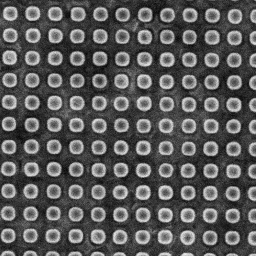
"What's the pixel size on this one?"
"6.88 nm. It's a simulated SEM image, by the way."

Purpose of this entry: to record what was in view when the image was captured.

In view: a regular array of raised bodies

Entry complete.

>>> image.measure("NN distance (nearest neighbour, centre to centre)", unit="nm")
152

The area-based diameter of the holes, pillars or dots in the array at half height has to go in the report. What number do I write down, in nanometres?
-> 94.8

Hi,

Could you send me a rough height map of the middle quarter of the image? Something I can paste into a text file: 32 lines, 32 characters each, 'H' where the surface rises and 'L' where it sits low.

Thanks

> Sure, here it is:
LLLLLLLLLLLLLLLLLLLLLLLLLHHLLLLL
LLLLLLLLLLLLLLLLLLLLLLLLLLLLLLLL
LLLLLLLLLLLLLLLLLLLLLLLLLLLLLLLL
LLHHHLLHHHLLLHHHLLLHHLLLHHHLLLHH
LLHHHLLHHHLLLHHHLLHHHHLLHHHLLLHH
LLHHLLLLHHLLLHHHLLLHHLLLHHHLLLHH
LLLLLLLLLLLLLLLLLLLLLLLLLLLLLLLL
LLLLLLLLLLLLLLLLLLLLLLLLLLLLLLLL
LLHHLLLHHHLLLHHLLLLHHLLLLLLLLLLL
LLHHHLLHHHLLLHHHLLHHHHLLHHHLLLHH
LLHHHLLHHHLLLHHHLLHHHHLLHHHLLLHH
LLLLLLLLLLLLLLLLLLLLLLLLLLLLLLHH
LLLLLLLLLLLLLLLLLLLLLLLLLLLLLLLL
LLLLLLLLLLLLLLLLLLLLLLLLLLLLLLLL
LLHHHLLHHHLLLHHHLLLHHLLLHHHLLLHH
LLHHHLLHHHLLLHHHLLHHHLLLHHHLLLHH
LLHHLLLLHHLLLHHHLLLHHLLLHHHLLLHH
LLLLLLLLLLLLLLLLLLLLLLLLLLLLLLLL
LLLLLLLLLLLLLLLLLLLLLLLLLLLLLLLL
LLHHLLLLHHLLLHHLLLLHLLLLLLLLLLLL
LLHHHLLHHHLLLHHHLLHHHLLLHHHLLLHH
LLHHHLLHHHLLLHHHLLHHHLLLHHHLLLHH
LLLLLLLLLLLLLLHLLLLHHLLLLHLLLLHH
LLLLLLLLLLLLLLLLLLLLLLLLLLLLLLLL
LLLLLLLLLLLLLLLLLLLLLLLLLLLLLLLL
LLHHHLLHHHLLLHHHLLLHHLLLHHHLLLHH
LHHHHLLHHHLLLHHHLLHHHLLLHHHLLHHH
LLHHLLLHHHLLLHHHLLHHHLLLHHHLLHHH
LLLLLLLLLLLLLLLLLLLLLLLLLLLLLLLL
LLLLLLLLLLLLLLLLLLLLLLLLLLLLLLLL
LLLLLLLLLLLLLLLLLLLLLLLLLLLLLLLL
LHHHHLLHHHLLLHHHLLHHHLLLHHHLLHHH